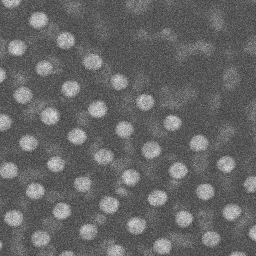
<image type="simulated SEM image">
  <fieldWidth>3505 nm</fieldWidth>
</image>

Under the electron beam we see a regular array of raised bodies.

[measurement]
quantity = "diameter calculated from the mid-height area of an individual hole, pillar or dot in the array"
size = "222 nm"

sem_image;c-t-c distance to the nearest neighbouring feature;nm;460